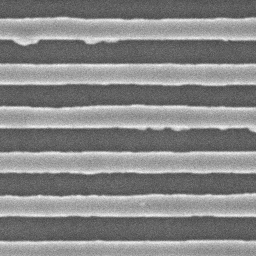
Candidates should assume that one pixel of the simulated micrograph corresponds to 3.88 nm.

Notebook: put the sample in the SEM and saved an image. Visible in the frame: lines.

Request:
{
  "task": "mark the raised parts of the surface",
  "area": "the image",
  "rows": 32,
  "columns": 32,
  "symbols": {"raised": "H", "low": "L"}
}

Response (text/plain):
LLLLLLLLLLLLLLLLLLLLLLLLLLLLLLLL
LLLLLLLLLLLLLLLLLLLLLLLLLLLLLLLL
HHHHHHHHHHHLHHHHLHLLHHHHHHHHHHHH
HHHHHHHHHHHHHHHHHHHHHHHHHHHHHHHH
HHHHHHHHHHHHHHHHHHHHHHHHHHHHHHHH
LLLHLLLLLLLLLLLLLLLLLLLLLLLLLLLL
LLLLLLLLLLLLLLLLLLLLLLLLLLLLLLLL
LLLLLLLLLLLLLLLLLLLLLLLLLLLLLLLL
HHHHHHHHHHHHHHHHHHHHHHHHHHHHHHHH
HHHHHHHHHHHHHHHHHHHHHHHHHHHHHHHH
HHHHHHHHLLLLHHLLLHHHHHHHHHHHHHHH
LLLLLLLLLLLLLLLLLLLLLLLLLLLLLLLL
LLLLLLLLLLLLLLLLLLLLLLLLLLLLLLLL
HHHHLLLLLLHHHHHHHHHHHHHHHHLHLLLL
HHHHHHHHHHHHHHHHHHHHHHHHHHHHHHHH
HHHHHHHHHHHHHHHHHHHHHHHHHHHHHHHH
LLLLLLLLLLLLLLLLLLLLLLLLLLLLLLLL
LLLLLLLLLLLLLLLLLLLLLLLLLLLLLLLL
LLLLLLLLLLLLLLLLLLLLLLLLLLLLLLLL
HHHHHHHHHHHHHHHHHHHHHHHHHHHHHHHH
HHHHHHHHHHHHHHHHHHHHHHHHHHHHHHHH
LLLLLLLLLHHHHLLLLHHHLLLLHHLLLHHL
LLLLLLLLLLLLLLLLLLLLLLLLLLLLLLLL
LLLLLLLLLLLLLLLLLLLLLLLLLLLLLLLL
LLLLHLLLLHLHLLLLLHHHHHHHHHHHHHHH
HHHHHHHHHHHHHHHHHHHHHHHHHHHHHHHH
HHHHHHHHHHHHHHHHHHHHHHHHHHHHHHHH
LLLLLLLLLLLLLLLLLLLLLLLLLLLLLLLL
LLLLLLLLLLLLLLLLLLLLLLLLLLLLLLLL
LLLLLLLLLLLLLLLLLLLLLLLLLLLLLLLL
HHHHHHHHHHHHHHHHHHHHHHHHHHHHHHHH
HHHHHHHHHHHHHHHHHHHHHHHHHHHHHHHH